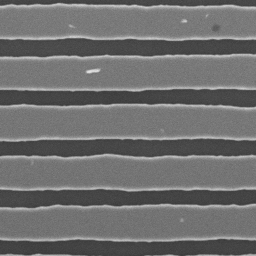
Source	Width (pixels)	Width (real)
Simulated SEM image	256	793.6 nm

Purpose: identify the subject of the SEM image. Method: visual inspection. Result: lines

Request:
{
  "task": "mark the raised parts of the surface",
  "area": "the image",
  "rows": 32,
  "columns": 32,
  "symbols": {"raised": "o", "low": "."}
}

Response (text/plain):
.......o........................
oooooooooooooooooooooooooooooooo
oooooooooooooooooooooooooooooooo
oooooooooooooooooooooooooooooooo
oooooooooooooooooooooooooooooooo
................................
................................
oooooooooooooooooooooooooooooooo
oooooooooooooooooooooooooooooooo
oooooooooooooooooooooooooooooooo
oooooooooooooooooooooooooooooooo
................................
................................
oooooooooooooooooooooooooooooooo
oooooooooooooooooooooooooooooooo
oooooooooooooooooooooooooooooooo
oooooooooooooooooooooooooooooooo
ooooo........................ooo
................................
...........ooooo........o......o
oooooooooooooooooooooooooooooooo
oooooooooooooooooooooooooooooooo
oooooooooooooooooooooooooooooooo
oooooooooooooooooooooooooooooooo
................................
................................
oooooooooooooooooooooooooooooooo
oooooooooooooooooooooooooooooooo
oooooooooooooooooooooooooooooooo
oooooooooooooooooooooooooooooooo
................................
................................